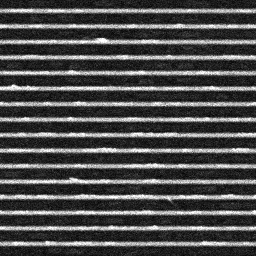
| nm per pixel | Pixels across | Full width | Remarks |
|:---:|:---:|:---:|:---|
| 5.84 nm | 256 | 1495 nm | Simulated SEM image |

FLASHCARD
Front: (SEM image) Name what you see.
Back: parallel lines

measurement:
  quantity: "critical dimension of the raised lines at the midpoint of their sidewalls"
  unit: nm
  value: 21.2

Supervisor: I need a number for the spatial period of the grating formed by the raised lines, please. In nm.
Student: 90.7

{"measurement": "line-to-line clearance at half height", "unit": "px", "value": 11.7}